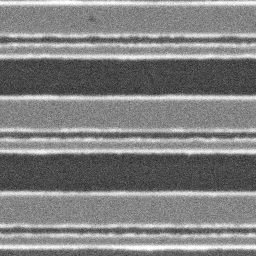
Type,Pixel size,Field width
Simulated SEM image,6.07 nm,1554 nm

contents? lines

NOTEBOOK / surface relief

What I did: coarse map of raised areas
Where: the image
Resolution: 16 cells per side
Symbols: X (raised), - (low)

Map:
XXXXXXXXXXXXXXXX
XXXXXXXXXXXXXXXX
XXXXXXXXXXXXXXXX
XXXXXXXXXXXXXXXX
----------------
----------------
XXXXXXXXXXXXXXXX
XXXXXXXXXXXXXXXX
XXXXXXXXXXXXXXXX
----------------
----------------
----------------
XXXXXXXXXXXXXXXX
XXXXXXXXXXXXXXXX
XXXXXXXXXXXXXXXX
----------------